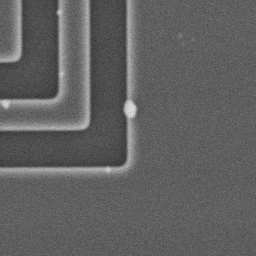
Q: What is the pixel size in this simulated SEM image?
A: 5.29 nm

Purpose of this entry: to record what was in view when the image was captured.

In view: groups of lines, slits or small figures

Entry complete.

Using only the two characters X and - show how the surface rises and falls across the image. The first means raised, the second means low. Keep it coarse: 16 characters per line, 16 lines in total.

X---XX--XXXXXXXX
X---XX--XXXXXXXX
X---XX--XXXXXXXX
X---XX--XXXXXXXX
----XX--XXXXXXXX
----XX--XXXXXXXX
XXXXXX--XXXXXXXX
XXXXXX--XXXXXXXX
--------XXXXXXXX
--------XXXXXXXX
------XXXXXXXXXX
XXXXXXXXXXXXXXXX
XXXXXXXXXXXXXXXX
XXXXXXXXXXXXXXXX
XXXXXXXXXXXXXXXX
XXXXXXXXXXXXXXXX